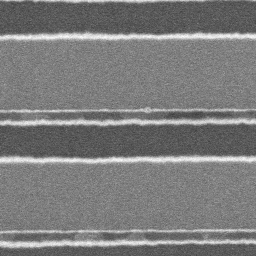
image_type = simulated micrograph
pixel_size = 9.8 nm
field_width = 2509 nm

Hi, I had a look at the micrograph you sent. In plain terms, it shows lines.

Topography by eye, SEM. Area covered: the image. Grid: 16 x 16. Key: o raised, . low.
................
................
oooooooooooooooo
oooooooooooooooo
oooooooooooooooo
oooooooooooooooo
oooooooooooooooo
oooooooooooooooo
................
................
oooooooooooooooo
oooooooooooooooo
oooooooooooooooo
oooooooooooooooo
oooooooooooooooo
................